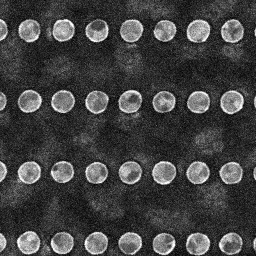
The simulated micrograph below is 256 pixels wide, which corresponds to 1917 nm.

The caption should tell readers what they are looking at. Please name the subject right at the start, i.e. a regular array of raised bodies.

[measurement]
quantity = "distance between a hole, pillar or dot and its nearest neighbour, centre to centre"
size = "251 nanometres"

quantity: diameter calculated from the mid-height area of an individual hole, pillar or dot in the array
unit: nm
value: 165